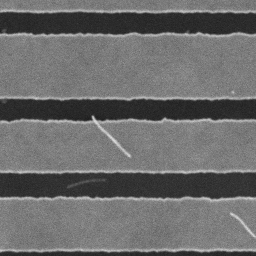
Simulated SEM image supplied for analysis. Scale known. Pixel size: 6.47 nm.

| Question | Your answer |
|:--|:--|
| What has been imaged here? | lines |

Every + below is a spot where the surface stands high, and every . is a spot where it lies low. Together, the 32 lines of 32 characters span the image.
++++++++++++++++++++++++++++++++
...++++.....+++..++++.++..++.+++
................................
................................
++++++++++++++++++++++++++++++++
++++++++++++++++++++++++++++++++
++++++++++++++++++++++++++++++++
++++++++++++++++++++++++++++++++
++++++++++++++++++++++++++++++++
++++++++++++++++++++++++++++++++
++++++++++++++++++++++++++++++++
++++++++++++++++++++++++++++++++
.......+.......++...+...+.+.....
................................
................................
++++++++++++++++++++++++++++++++
++++++++++++++++++++++++++++++++
++++++++++++++++++++++++++++++++
++++++++++++++++++++++++++++++++
++++++++++++++++++++++++++++++++
++++++++++++++++++++++++++++++++
+++++++++++++++++++++++++++++.+.
................................
................................
................................
++++++++++++++++++++++++++++++++
++++++++++++++++++++++++++++++++
++++++++++++++++++++++++++++++++
++++++++++++++++++++++++++++++++
++++++++++++++++++++++++++++++++
++++++++++++++++++++++++++++++++
................................